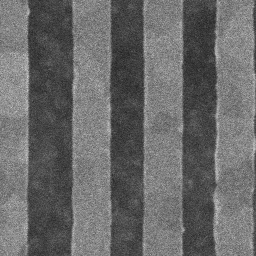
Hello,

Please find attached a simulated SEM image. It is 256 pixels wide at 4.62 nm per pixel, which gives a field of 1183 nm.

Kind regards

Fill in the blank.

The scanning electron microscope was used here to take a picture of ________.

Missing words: one or a few lines or trenches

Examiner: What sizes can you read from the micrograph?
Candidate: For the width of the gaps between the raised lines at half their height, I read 158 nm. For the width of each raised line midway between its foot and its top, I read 174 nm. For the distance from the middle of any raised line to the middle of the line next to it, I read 331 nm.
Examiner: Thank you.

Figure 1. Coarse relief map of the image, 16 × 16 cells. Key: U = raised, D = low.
UUDDDUUDDUUDDDUU
UUDDDUUDDUUDDDUU
UUDDDUUDDUUDDDUU
UUDDDUUDDUUDDDUU
UUDDDUUDDUUDDDUU
UUDDDUUDDUUDDDUU
UUDDDUUDDUUDDDUU
UUDDDUUDDUUDDDUU
UUDDDUUDDUUDDDUU
UUDDDUUDDUUDDUUU
UUDDDUUDDUUDDDUU
UUDDDUUDDUUDDDUU
UUDDUUUDDUUDDUUU
UUDDDUUDDUUDDUUU
UUDDDUUDDUUDDUUU
UUDDUUUDDUUDDDUU